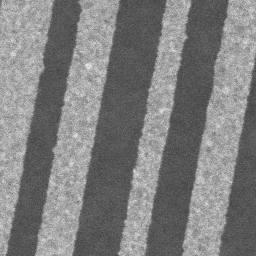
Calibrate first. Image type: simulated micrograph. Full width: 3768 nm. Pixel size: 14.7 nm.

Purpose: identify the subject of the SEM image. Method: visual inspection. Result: one or a few lines or trenches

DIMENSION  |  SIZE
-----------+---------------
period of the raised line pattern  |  1070 nanometers